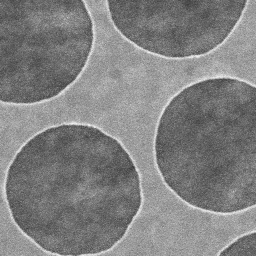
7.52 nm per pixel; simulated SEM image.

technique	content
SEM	holes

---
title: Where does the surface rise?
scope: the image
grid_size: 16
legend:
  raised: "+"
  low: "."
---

.....++........+
......+........+
......++......++
......++++..++++
.....+++++++++++
....++++++++....
+++++++++++.....
++++++++++......
++.....+++......
+.......++......
+.......++......
.........+......
.........++.....
+.......++++++++
+.......++++++++
+++....+++++++..